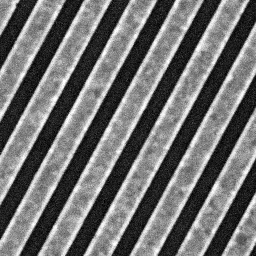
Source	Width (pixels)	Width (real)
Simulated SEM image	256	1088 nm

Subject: parallel lines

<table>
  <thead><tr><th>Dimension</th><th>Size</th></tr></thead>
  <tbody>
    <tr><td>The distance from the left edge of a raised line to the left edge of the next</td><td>172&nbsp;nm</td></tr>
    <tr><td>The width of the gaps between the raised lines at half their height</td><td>82.2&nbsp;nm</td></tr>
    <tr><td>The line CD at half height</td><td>90.1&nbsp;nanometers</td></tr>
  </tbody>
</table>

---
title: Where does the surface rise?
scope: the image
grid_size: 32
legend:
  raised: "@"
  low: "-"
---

@@---@@@--@@@@--@@@---@@@---@@@-
@---@@@---@@@---@@@--@@@---@@@--
@---@@@--@@@---@@@---@@@---@@@--
---@@@---@@@---@@@--@@@---@@@---
---@@@--@@@---@@@---@@@---@@---@
--@@@---@@@---@@---@@@---@@@---@
--@@@--@@@---@@@---@@@--@@@---@@
-@@@---@@@--@@@---@@@---@@@---@@
@@@---@@@---@@@---@@@--@@@---@@@
@@@---@@@--@@@---@@@---@@@---@@@
@@---@@@---@@@---@@---@@@---@@@-
@@---@@@--@@@---@@@---@@@--@@@--
@---@@@---@@@--@@@---@@@---@@@--
@--@@@---@@@---@@@---@@@--@@@---
---@@@---@@@--@@@---@@@---@@@---
--@@@---@@@---@@@---@@@--@@@---@
--@@@---@@---@@@---@@@---@@@---@
-@@@---@@@---@@@---@@---@@@---@@
-@@@---@@---@@@---@@@---@@@--@@@
@@@---@@@---@@@--@@@---@@@---@@@
@@@--@@@---@@@---@@@---@@@--@@@-
@@---@@@---@@@--@@@---@@@---@@@-
@@--@@@---@@@---@@@---@@@--@@@--
@---@@@---@@---@@@---@@@---@@@--
---@@@---@@@---@@@--@@@---@@@---
---@@@--@@@---@@@---@@@---@@@--@
--@@@---@@@---@@@--@@@---@@@---@
--@@@--@@@---@@@---@@@---@@@--@@
-@@@---@@@---@@@--@@@---@@@---@@
-@@---@@@---@@@---@@@---@@---@@@
@@@---@@@--@@@---@@@---@@@---@@@
@@---@@@---@@@---@@@--@@@---@@@-